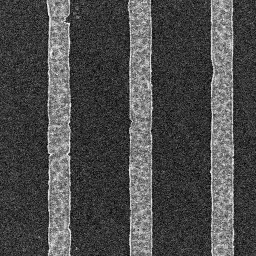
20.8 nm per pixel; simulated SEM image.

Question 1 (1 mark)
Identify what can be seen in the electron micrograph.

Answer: one or a few lines or trenches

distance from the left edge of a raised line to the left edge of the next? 1700 nanometres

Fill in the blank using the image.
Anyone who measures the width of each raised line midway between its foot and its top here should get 0.438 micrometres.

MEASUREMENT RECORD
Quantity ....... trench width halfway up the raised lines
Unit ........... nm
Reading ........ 1260